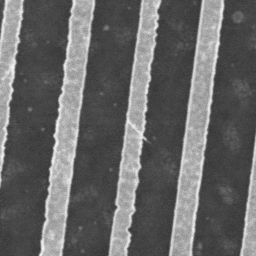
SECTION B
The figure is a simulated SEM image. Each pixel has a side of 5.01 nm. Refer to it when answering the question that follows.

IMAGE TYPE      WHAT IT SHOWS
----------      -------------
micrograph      one or a few lines or trenches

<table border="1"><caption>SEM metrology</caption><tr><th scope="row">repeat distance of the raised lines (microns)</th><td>0.322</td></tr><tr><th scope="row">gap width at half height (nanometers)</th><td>242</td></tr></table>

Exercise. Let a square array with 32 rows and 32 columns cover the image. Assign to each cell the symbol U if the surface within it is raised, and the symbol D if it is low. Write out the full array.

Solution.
DUUDDDDDDUUUDDDDDDUUDDDDDUUUDDDD
DUUDDDDDDUUUDDDDDDUUDDDDDUUUDDDD
UUUDDDDDDUUDDDDDDDUUDDDDDUUUDDDD
UUDDDDDDDUUDDDDDDUUDDDDDDUUDDDDD
UUDDDDDDDUUDDDDDDUUDDDDDDUUDDDDD
UUDDDDDDDUUDDDDDDUUDDDDDDUUDDDDD
UUDDDDDDUUUDDDDDDUUDDDDDDUUDDDDD
UUDDDDDDUUUDDDDDDUUDDDDDUUUDDDDD
UUDDDDDDUUUDDDDDDUUDDDDDUUUDDDDD
UUDDDDDDUUUDDDDDDUUDDDDDUUUDDDDD
UDDDDDDDUUDDDDDDUUUDDDDDUUUDDDDD
UDDDDDDDUUDDDDDDUUDDDDDDUUDDDDDD
UDDDDDDUUUDDDDDDUUDDDDDDUUDDDDDD
UDDDDDDDUUDDDDDDUUDDDDDDUUDDDDDD
UDDDDDDUUUDDDDDDUUDDDDDDUUDDDDDD
UDDDDDDUUUDDDDDDUUDDDDDUUUDDDDDD
UDDDDDDUUUDDDDDDUUDDDDDUUUDDDDDD
UDDDDDDUUUDDDDDDUUDDDDDUUUDDDDDD
DDDDDDDUUDDDDDDUUUDDDDDUUUDDDDDD
DDDDDDDUUDDDDDDUUDDDDDDUUDDDDDDD
DDDDDDDUUDDDDDDUUDDDDDDUUDDDDDDD
DDDDDDUUUDDDDDDUUDDDDDDUUDDDDDDD
DDDDDDUUUDDDDDDUUDDDDDUUUDDDDDDU
DDDDDDUUUDDDDDDUUDDDDDUUUDDDDDDU
DDDDDDUUUDDDDDDUUDDDDDUUUDDDDDDU
DDDDDDUUDDDDDDDUUDDDDDUUUDDDDDDU
DDDDDDUUDDDDDDDUUDDDDDUUDDDDDDDU
DDDDDDUUDDDDDDUUDDDDDDUUDDDDDDDU
DDDDDDUUDDDDDDUUDDDDDDUUDDDDDDDU
DDDDDUUUDDDDDDUUDDDDDDUUDDDDDDDU
DDDDDUUUDDDDDDUUDDDDDUUUDDDDDDUU
DDDDDUUUDDDDDDUUDDDDDUUUDDDDDDUU